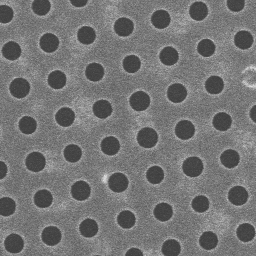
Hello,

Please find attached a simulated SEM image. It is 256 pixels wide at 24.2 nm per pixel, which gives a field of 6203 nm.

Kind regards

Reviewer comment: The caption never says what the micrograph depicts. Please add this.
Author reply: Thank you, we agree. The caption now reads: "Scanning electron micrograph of a regular array of holes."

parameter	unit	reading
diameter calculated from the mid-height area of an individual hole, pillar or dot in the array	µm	0.482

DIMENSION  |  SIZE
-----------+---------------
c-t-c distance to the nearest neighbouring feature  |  0.912 microns